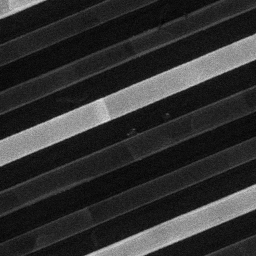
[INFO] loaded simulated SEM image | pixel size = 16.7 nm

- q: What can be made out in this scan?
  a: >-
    lines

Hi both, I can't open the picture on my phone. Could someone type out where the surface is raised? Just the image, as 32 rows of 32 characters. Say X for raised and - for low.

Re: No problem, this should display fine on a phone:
XXXX--------XXXXXXX--------XXXXX
XX--------XXXXXX--------XXXXXX--
--------XXXXXX--------XXXXXX----
-----XXXXXX--------XXXXXXX------
---XXXXXX--------XXXXXX--------X
XXXXXXX--------XXXXXX--------XXX
XXXX--------XXXXXX---------XXXXX
XX--------XXXXXX--------XXXXXXXX
--------XXXXXX--------XXXXXXX---
-----XXXXXX--------XXXXXXXX-----
---XXXXXX--------XXXXXXXX-------
XXXXXXX--------XXXXXXX--------XX
XXXX--------XXXXXXXX--------XXXX
XX--------XXXXXXX--------XXXXXXX
-------XXXXXXXX--------XXXXXXX--
-----XXXXXXXX-------XXXXXXXX----
---XXXXXXX--------XXXXXXX-------
XXXXXXXX--------XXXXXXX--------X
XXXXX--------XXXXXXXX--------XXX
XXX--------XXXXXXX--------XXXXXX
X--------XXXXXXX--------XXXXXX--
------XXXXXXXX--------XXXXXX----
----XXXXXXX--------XXXXXXX------
-XXXXXXX---------XXXXXX--------X
XXXXXX--------XXXXXXX--------XXX
XXXX--------XXXXXX---------XXXXX
X--------XXXXXXX--------XXXXXXX-
-------XXXXXXX--------XXXXXX----
-----XXXXXX--------XXXXXXX------
--XXXXXXX--------XXXXXXX--------
XXXXXX---------XXXXXX--------XXX
XXXX--------XXXXXXX--------XXXXX